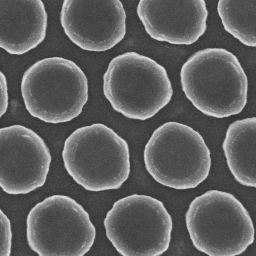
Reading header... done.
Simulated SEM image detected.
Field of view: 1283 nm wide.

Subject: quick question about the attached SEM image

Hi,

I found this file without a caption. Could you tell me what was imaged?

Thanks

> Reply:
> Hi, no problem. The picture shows raised bodies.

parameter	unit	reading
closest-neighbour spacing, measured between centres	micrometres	0.398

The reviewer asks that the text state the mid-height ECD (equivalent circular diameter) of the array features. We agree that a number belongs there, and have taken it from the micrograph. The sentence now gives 329 nanometres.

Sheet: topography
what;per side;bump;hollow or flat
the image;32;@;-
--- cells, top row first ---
@@@@@---@@@@@@@--@@@@@@@@@-@@@@@
@@@@@@--@@@@@@@@-@@@@@@@@@-@@@@@
@@@@@@--@@@@@@@@--@@@@@@@@--@@@@
@@@@@@--@@@@@@@@--@@@@@@@---@@@@
@@@@@----@@@@@@----@@@@@@----@@@
@@@@@-----@@@@-----------------@
-@@-----------------------@@----
-----@@@------@@@@@-----@@@@@@--
----@@@@@@----@@@@@@---@@@@@@@--
---@@@@@@@@--@@@@@@@@--@@@@@@@@-
@--@@@@@@@@--@@@@@@@@--@@@@@@@@-
@--@@@@@@@@--@@@@@@@@--@@@@@@@@-
@--@@@@@@@@---@@@@@@@---@@@@@@@-
@--@@@@@@@-----@@@@@-----@@@@@--
----@@@@@@------@@@--------@----
---------------------@@------@@@
@@@@-----@@@@@-----@@@@@@---@@@@
@@@@@---@@@@@@@----@@@@@@---@@@@
@@@@@@--@@@@@@@@--@@@@@@@@--@@@@
@@@@@@--@@@@@@@@--@@@@@@@@--@@@@
@@@@@@--@@@@@@@@--@@@@@@@@---@@@
@@@@@@---@@@@@@@---@@@@@@@---@@@
@@@@@@---@@@@@@@---@@@@@@-----@@
@@@@-------@@@--------@---------
----------------@@-------@@@@---
-----@@@@@----@@@@@@----@@@@@@--
----@@@@@@@---@@@@@@@---@@@@@@@-
@---@@@@@@@--@@@@@@@@--@@@@@@@@-
@---@@@@@@@@-@@@@@@@@---@@@@@@@@
@---@@@@@@@@-@@@@@@@@---@@@@@@@@
@---@@@@@@@---@@@@@@@---@@@@@@@-
@----@@@@@@----@@@@@------@@@@--